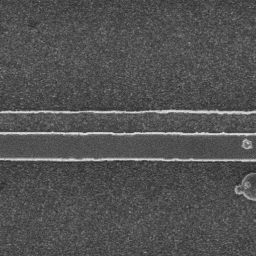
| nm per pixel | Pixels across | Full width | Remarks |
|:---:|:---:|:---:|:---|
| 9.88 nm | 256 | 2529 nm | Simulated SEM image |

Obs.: lines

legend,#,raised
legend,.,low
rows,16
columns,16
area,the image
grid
................
................
................
................
................
................
................
################
################
################
................
................
................
................
................
................